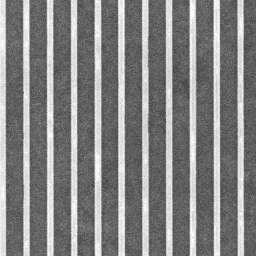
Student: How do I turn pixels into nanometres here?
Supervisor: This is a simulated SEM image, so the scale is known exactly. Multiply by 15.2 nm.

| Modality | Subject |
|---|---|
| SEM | parallel lines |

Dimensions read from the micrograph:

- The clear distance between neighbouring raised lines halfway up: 0.283 micrometres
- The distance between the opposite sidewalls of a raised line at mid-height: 0.0778 µm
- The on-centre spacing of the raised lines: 362 nanometres